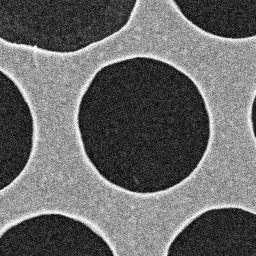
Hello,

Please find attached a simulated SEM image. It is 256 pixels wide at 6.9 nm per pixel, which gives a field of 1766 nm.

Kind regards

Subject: holes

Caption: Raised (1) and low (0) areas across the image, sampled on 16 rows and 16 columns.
0000000011100000
0000000011110000
0000001111111111
1111111111111111
1111110000011111
0111100000001111
0011100000000111
0011100000000111
0011100000000111
0011100000000111
0011110000001111
0111111000011111
1111111111111111
1100111111110000
0000001111100000
0000000111100000